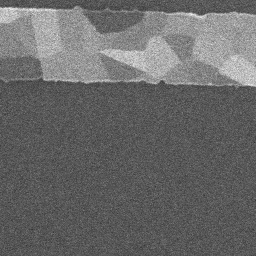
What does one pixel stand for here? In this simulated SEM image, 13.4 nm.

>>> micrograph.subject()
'one or a few lines or trenches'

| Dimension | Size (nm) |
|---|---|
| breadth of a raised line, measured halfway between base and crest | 949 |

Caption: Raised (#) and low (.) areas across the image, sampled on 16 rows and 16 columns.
................
################
################
################
################
................
................
................
................
................
................
................
................
................
................
................